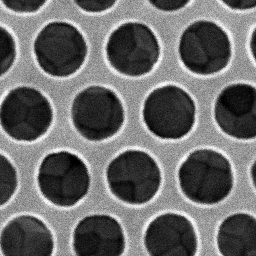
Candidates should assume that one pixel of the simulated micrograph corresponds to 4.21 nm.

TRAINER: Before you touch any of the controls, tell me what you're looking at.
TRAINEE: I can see a regular array of holes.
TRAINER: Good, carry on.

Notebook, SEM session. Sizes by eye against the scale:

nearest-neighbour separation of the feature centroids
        0.303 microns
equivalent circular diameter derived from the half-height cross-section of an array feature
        228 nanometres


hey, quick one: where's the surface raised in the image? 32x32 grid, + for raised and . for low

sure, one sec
......++++....+++++....+++++....
++..+++++++.++++++++++++++++++++
++++++++++++++++++++++++++++++++
+++++.....+++++....++++.....++++
.++++.....++++.....++++......++.
..++.......++.......++.......++.
..++.......++.......++.......++.
..+++......++.......+++......+++
.++++.....++++.....++++.....++++
+++++++..+++++++..++++++++++++++
+++++++++++++++++++++++++++++..+
+....+++++....+++++....+++++....
......+++......+++......+++.....
......+++......+++......+++.....
.......++.......++......+++.....
......+++......+++......+++.....
+.....++++.....++++.....++++....
++..+++++++..+++++++++++++++++++
++++++++++++++++++++++++++++++++
.+++++....+++++....++++.....++++
.++++......+++......+++......+++
..+++......++.......++.......++.
..+++......++.......++.......++.
..+++......+++......+++......+++
..+++......+++.....++++.....++++
.++++++..+++++++..+++++++..+++++
++++++++++++++++++++++++++++++++
+....+++++....+++++.....++++....
......+++......+++......+++.....
.......++.......++.......++.....
.......++.......++.......++.....
.......++......+++.......++.....